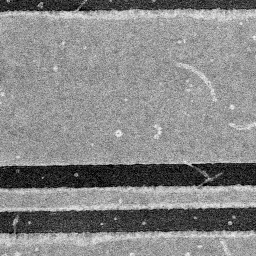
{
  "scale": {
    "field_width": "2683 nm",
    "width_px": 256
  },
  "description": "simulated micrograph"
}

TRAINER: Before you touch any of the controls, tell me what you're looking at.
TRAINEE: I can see lines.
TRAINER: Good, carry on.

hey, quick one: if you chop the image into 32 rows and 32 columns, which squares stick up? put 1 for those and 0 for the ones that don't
00000000000000000000000000000000
00000000010000000000011110010001
11111111111111111111111111111111
11111111111111111111111111111111
11111111111111111111111111111111
11111111111111111111111111111111
11111111111111111111111111111111
11111111111111111111111111111111
11111111111111111111111111111111
11111111111111111111111111111111
11111111111111111111111111111111
11111111111111111111111111111111
11111111111111111111111111111111
11111111111111111111111111111111
11111111111111111111111111111111
11111111111111111111111111111111
11111111111111111111111111111111
11111111111111111111111111111111
11111111111111111111111111111111
11111111111111111111111111111111
11111111100000000000000100000000
00000000000000000000000000000000
00000000000000000000000000000000
00000000001111111111111111111111
11111111111111111111111111111111
11111111111111111111111111111111
00000000000000000000000000000000
00000000000000000000000000000000
00000000000000000000000000000000
00000000000011111111111111111111
11111111111111111111111111111111
11111111111111111111111111111111